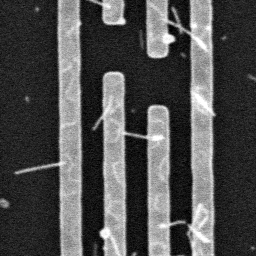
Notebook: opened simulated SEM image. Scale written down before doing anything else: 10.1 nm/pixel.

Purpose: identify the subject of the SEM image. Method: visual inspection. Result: groups of lines, slits or small figures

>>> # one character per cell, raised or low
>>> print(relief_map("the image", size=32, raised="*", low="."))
.......***...**....**...**......
.......***...**....**...**......
.......***...**...***...**......
.......***........***...**......
.......***.........**...**......
.......***.........**...**......
.......***.........**...**......
.......***..............**......
........**..............**......
........**...**.........**......
........**...**.........**......
........**...**.........**......
........**...**.........**......
........**...**....*....**......
........**...**....**...***.....
........**...**....**...**......
........**...***...**...**......
........**...**...***...**......
........**...**....**...**......
........**...**....**...**......
........**...**....**...**......
........**...**....**...**......
........**...***...**...**......
........**...***...**...***.....
........**...***...**...**......
........**...***...**...***.....
........**...***...**...***.....
........**...***...**...***.....
........**...***...**...***.....
........**...***...**...***.....
........**...***...**...***.....
........**...***...**...***.....